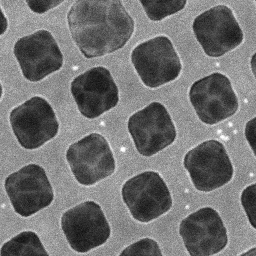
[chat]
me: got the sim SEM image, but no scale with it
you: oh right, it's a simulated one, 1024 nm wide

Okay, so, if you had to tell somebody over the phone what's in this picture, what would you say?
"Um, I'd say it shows a regular array of holes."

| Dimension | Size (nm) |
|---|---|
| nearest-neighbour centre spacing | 269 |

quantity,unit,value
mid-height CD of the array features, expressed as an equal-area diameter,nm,195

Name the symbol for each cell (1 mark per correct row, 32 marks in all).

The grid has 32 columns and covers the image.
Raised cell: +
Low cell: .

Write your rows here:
+++....++......+++.....+++++++++
++++..+++.......++....+++....+++
.+++++++.........++.++++......++
.++++++++........+++++++......++
+++....++.......++++++++......++
++.....++.......+.....+++.....++
++......++....+++.....++++..++++
++......++++++++......+++++++++.
+++....+++++.++++......++++++++.
+++...++++....+++.....++++..++++
+++++++++.....++++...+++.....+++
+++++++++......+++++++++.....+++
+++...+++......+++++++++......++
++.....+++....++++...+++......++
+......++++.++++.....++++....+++
+......+++++++++......++++.++++.
++.....+++++++++......+++++++++.
++....++++...++++.....++++.++++.
+++..++++.....+++....+++....+++.
++++++++......++++.++++......+++
+++++++++.....+++++++++......+++
++....+++.....++++.+++++.....+++
+.....++++...+++....++++.....+++
+......++++++++......+++...++++.
+......++++++++......+++++++++..
+.....++++..++++......++++++++..
++...+++.....+++.....+++...++++.
++++++++.....++++..++++.....+++.
++++++++......++++++++......++++
++...+++......+++++++++.....++++
+....++++....+++....+++.....++++
......++++.++++.....+++....++++.